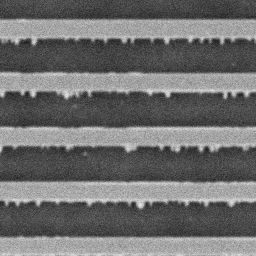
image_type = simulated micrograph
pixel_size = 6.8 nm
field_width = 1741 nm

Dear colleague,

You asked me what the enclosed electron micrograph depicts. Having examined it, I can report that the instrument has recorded lines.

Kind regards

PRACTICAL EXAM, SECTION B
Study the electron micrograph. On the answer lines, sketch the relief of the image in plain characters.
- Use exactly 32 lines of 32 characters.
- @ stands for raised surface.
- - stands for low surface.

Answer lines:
--------------------------------
--------------------------------
--@-----------------------------
@@@@@@@@@@@@@@@@@@@@@@@@@@@@@@@@
@@@@@@@@@@@@@@@@@@@@@@@@@@@@@@@@
--------------------------------
--------------------------------
--------------------------------
--------------------------------
@@@@@@@@@@@@@@@@@@@@@@@@@@@@@@@@
@@@@@@@@@@@@@@@@@@@@@@@@@@@@@@@@
@---@---@@-@--------@@------@@@@
--------------------------------
--------------------------------
--------------------------------
--------------------------------
@@@@@@@@@@@@@@@@@@@@@@@@@@@@@@@@
@@@@@@@@@@@@@@@@@@@@@@@@@@@@@@@@
--------------------------------
--------------------------------
--------------------------------
--------------------------------
--------------------------------
@@@@@@@@@@@@@@@@@@@@@@@@@@@@@@@@
@@@@@@@@@@@@@@@@@@@@@@@@@@@@@@@@
-----------------@--------------
--------------------------------
--------------------------------
--------------------------------
--------------------------------
@@@@@@@@@@@@@@@@@@@@@@@@@@@@@@@@
@@@@@@@@@@@@@@@@@@@@@@@@@@@@@@@@